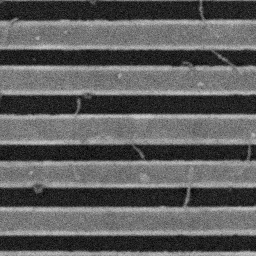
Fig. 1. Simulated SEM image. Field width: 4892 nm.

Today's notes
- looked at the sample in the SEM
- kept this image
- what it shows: lines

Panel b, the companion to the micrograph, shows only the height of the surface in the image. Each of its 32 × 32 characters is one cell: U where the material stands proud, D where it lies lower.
DDDDDDDDDDDDDDDDDDDDDDDDDDDDDDDD
DDDDDDDDDDDDDDDDDDDDDDDDDDDDDDDD
DDDDDDDDDDDDDDDDDDDDDDDDDDDDDDDD
UUUUUUUUUUUUUUUUUUUUUUUUUUUUUUUU
UUUUUUUUUUUUUUUUUUUUUUUUUUUUUUUU
UUUUUUUUUUUUUUUUUUUUUUUUUUUUUUUU
DDDDDDDDDDDDDDDDDDDDDDDDDDDDDDDD
DDDDDDDDDDDDDDDDDDDDDDDDDDDDDDDD
DDDDDDDDDDDDDDDDDDDDDDDUUDDDDUDD
UUUUUUUUUUUUUUUUUUUUUUUUUUUUUUUU
UUUUUUUUUUUUUUUUUUUUUUUUUUUUUUUU
DDDDDDDDDDUUDDDDDDDDUUUUUUUUUUUU
DDDDDDDDDDDDDDDDDDDDDDDDDDDDDDDD
DDDDDDDDDDDDDDDDDDDDDDDDDDDDDDDD
DDDDDDDDDUDDDDDDDDDDDDDDDDDDDDDD
UUUUUUUUUUUUUUUUUUUUUUUUUUUUUUUU
UUUUUUUUUUUUUUUUUUUUUUUUUUUUUUUU
UUUUUUUUUUUUUUUUUUUUUUUUUUUUUUUU
DDDDDDDDDDDDDDDDDDDDDDDDDDDDDDDD
DDDDDDDDDDDDDDDDDDDDDDDDDDDDDDDD
DDDDDUUUUUUUUUUUUUUUUUUUUUUUUUUU
UUUUUUUUUUUUUUUUUUUUUUUUUUUUUUUU
UUUUUUUUUUUUUUUUUUUUUUUUUUUUUUUU
DDDDDDDDDDDDDDDDDDDDDDDDDDDDDDDD
DDDDDDDDDDDDDDDDDDDDDDDDDDDDDDDD
DDDDDDDDDDDDDDDDDDDDDDDDDDDDDDDD
UUUUUUUUUUUUUUUUUUUUUUUUUUUUUUUU
UUUUUUUUUUUUUUUUUUUUUUUUUUUUUUUU
UUUUUUUUUUUUUUUUUUUUUUUUUUUUUUUU
DDDDDDDDDDDDDDDDDDDDDDDDDDDDDDDD
DDDDDDDDDDDDDDDDDDDDDDDDDDDDDDDD
DDDDDDDDDDDDDDDDDDDDDDDDDDDDDDDD